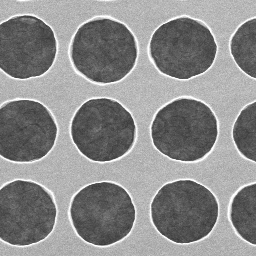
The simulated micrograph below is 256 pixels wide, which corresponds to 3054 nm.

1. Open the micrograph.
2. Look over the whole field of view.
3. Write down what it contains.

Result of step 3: holes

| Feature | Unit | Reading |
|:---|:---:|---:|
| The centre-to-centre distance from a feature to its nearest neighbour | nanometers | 958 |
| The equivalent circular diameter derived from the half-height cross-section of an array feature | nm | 766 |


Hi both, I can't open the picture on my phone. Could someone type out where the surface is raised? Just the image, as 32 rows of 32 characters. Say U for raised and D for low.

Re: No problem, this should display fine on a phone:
UUUUUUUUUUUUUUUUUUUUUUUUUUUUUUUU
UUUUUUUUUUUUUUUUUUUUUUUUUUUUUUUU
UDDDDUUUUUUUDDUUUUUUUUDDUUUUUUUD
DDDDDDUUUUDDDDDDUUUUDDDDDDUUUUDD
DDDDDDDUUDDDDDDDDUUDDDDDDDDUUDDD
DDDDDDDUUDDDDDDDDUUDDDDDDDDUUDDD
DDDDDDDUUDDDDDDDDUUDDDDDDDDUUDDD
DDDDDDDUUDDDDDDDDUUDDDDDDDDUUDDD
DDDDDDUUUUDDDDDDDUUUDDDDDDUUUUDD
UDDDDUUUUUUDDDDDUUUUUDDDUUUUUUUD
UUUUUUUUUUUUUUUUUUUUUUUUUUUUUUUU
UUUUUUUUUUUUUUUUUUUUUUUUUUUUUUUU
UUUUUUUUUUUDDDUUUUUUUUDDDUUUUUUU
DDDDDDUUUUDDDDDUUUUUDDDDDDUUUUUD
DDDDDDDUUDDDDDDDUUUUDDDDDDDUUUDD
DDDDDDDUUDDDDDDDDUUDDDDDDDDUUDDD
DDDDDDDUUDDDDDDDDUUDDDDDDDDUUDDD
DDDDDDDUUDDDDDDDDUUDDDDDDDDUUDDD
DDDDDDUUUUDDDDDDUUUUDDDDDDUUUUDD
DDDDDDUUUUUDDDDUUUUUUDDDDUUUUUUD
UUUUUUUUUUUUUUUUUUUUUUUUUUUUUUUU
UUUUUUUUUUUUUUUUUUUUUUUUUUUUUUUU
UUUUUUUUUUUUUUUUUUUUUUUUUUUUUUUU
DDDDDUUUUUUDDDDUUUUUDDDDDDUUUUDD
DDDDDDUUUDDDDDDDUUUDDDDDDDDUUDDD
DDDDDDDUUDDDDDDDDUUDDDDDDDDUUDDD
DDDDDDDUUDDDDDDDDUUDDDDDDDDUUDDD
DDDDDDDUUDDDDDDDDUUDDDDDDDDUUDDD
DDDDDDDUUDDDDDDDUUUUDDDDDDDUUDDD
DDDDDDUUUUDDDDDDUUUUUDDDDDUUUUDD
UUDDUUUUUUUUDDUUUUUUUUUUUUUUUUUU
UUUUUUUUUUUUUUUUUUUUUUUUUUUUUUUU